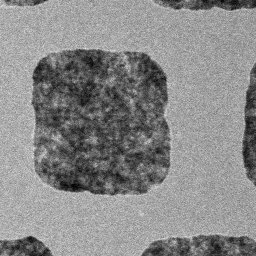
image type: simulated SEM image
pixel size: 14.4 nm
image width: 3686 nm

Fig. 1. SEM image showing holes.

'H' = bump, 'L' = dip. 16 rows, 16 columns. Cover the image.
HHHHHHHHHHLLLLLL
HHHHHHHHHHHHHHHH
HHHHHHHHHHHHHHHH
HHHLLLLLLHHHHHHH
HHLLLLLLLLHHHHHH
HHLLLLLLLLHHHHHL
HHLLLLLLLLHHHHHL
HHLLLLLLLLHHHHHL
HHLLLLLLLLLHHHHL
HHLLLLLLLLLHHHHL
HHLLLLLLLLLHHHHL
HHHLLLLLLLHHHHHH
HHHHHHHHHHHHHHHH
HHHHHHHHHHHHHHHH
HHHHHHHHHHHHHHHH
LLLHHHHHHLLLLLLL